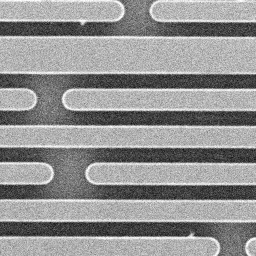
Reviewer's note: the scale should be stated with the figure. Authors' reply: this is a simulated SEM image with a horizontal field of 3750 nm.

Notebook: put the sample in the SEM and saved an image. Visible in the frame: groups of lines, slits or small figures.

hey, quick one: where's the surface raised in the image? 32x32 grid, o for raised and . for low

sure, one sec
ooooooooooooooo....ooooooooooooo
ooooooooooooooo....ooooooooooooo
ooooooooooooooo.....oooooooooooo
................................
................................
oooooooooooooooooooooooooooooooo
oooooooooooooooooooooooooooooooo
oooooooooooooooooooooooooooooooo
oooooooooooooooooooooooooooooooo
................................
................................
oooo....oooooooooooooooooooooooo
oooo....oooooooooooooooooooooooo
oooo.....ooooooooooooooooooooooo
................................
................................
oooooooooooooooooooooooooooooooo
oooooooooooooooooooooooooooooooo
................................
................................
oooooo......ooooooooo...........
ooooooo....ooooooooooooooooooooo
oooooo.....ooooooooooooooooooooo
................................
................................
oooooooooooooooooooooooooooooooo
oooooooooooooooooooooooooooooooo
oooooooooooooooooooooooooooooooo
................................
................................
ooooooooooooooooooooooooooo....o
ooooooooooooooooooooooooooo....o